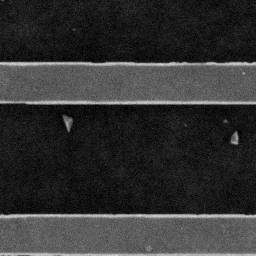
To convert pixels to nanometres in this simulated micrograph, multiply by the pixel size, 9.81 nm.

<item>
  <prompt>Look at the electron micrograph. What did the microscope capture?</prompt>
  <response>lines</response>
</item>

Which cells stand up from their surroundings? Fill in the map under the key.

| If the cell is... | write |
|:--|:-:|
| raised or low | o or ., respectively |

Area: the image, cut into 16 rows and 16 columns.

................
................
................
................
oooooooooooooooo
oooooooooooooooo
................
................
................
................
................
................
................
oooooooooooooooo
oooooooooooooooo
oooooooooooooooo